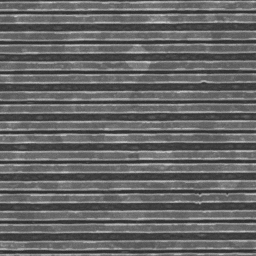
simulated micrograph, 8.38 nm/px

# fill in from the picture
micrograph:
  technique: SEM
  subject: parallel lines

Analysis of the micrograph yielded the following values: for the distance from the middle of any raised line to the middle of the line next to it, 0.125 micrometres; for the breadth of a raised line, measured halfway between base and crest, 66 nm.